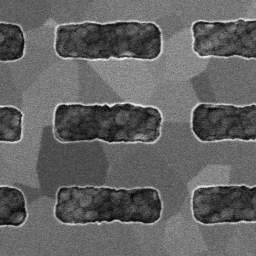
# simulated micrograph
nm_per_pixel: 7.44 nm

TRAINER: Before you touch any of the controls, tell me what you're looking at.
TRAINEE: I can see holes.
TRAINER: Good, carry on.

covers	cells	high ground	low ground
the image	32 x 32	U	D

UUUUUUUUUUUUUUUUUUUUUUUUUUUUUUUU
UUUUUUUUUUUUUUUUUUUUUUUUUUUUUUUU
UUUUUUUUUUUUUUUUUUUUUUUUUUUUUUUU
DDDUUUUDDDDDDDDDUDDDUUUUDDDDDDDD
DDDUUUUDDDDDDDDDDDDDUUUUDDDDDDDD
DDDUUUUDDDDDDDDDDDDDUUUUDDDDDDDD
DDDUUUUDDDDDDDDDDDDDUUUUDDDDDDDD
DDUUUUUUUUUUUUUUUUUUUUUUUUUUUUUU
UUUUUUUUUUUUUUUUUUUUUUUUUUUUUUUU
UUUUUUUUUUUUUUUUUUUUUUUUUUUUUUUU
UUUUUUUUUUUUUUUUUUUUUUUUUUUUUUUU
UUUUUUUUUUUUUUUUUUUUUUUUUUUUUUUU
UUUUUUUUUUUUUUUUUUUUUUUUUUUUUUUU
DDUUUUUDDDDDDDDDDDDUUUUUDDDDDDDD
DDDUUUUDDDDDDDDUDDDDUUUUDDDDDDDD
DDDUUUUDDDDDDDDDUDDDUUUUDDDDDDDD
DDDUUUUDDDDDDDDDDDDDUUUUDDDDDDDD
DDUUUUUDDDDUUDDDDUDUUUUUUDDDUUDD
UUUUUUUUUUUUUUUUUUUUUUUUUUUUUUUU
UUUUUUUUUUUUUUUUUUUUUUUUUUUUUUUU
UUUUUUUUUUUUUUUUUUUUUUUUUUUUUUUU
UUUUUUUUUUUUUUUUUUUUUUUUUUUUUUUU
UUUUUUUUUUUUUUUUUUUUUUUUUUUUUUUU
DDUUUUUUDDDDDDUUUUDUUUUUUDDDDDDD
DDDUUUUDDDDDDDDDDDDDUUUUDDDDDDDD
DDDUUUUDDDDDDDDDDDDDUUUUDDDDDDDD
UDDUUUUDDDDDDDDDDDDDUUUUDDDDUDDD
DDUUUUUDDDDUDDDDDDDDUUUUUDDDDDDD
UUUUUUUUUUUUUUUUUUUUUUUUUUUUUUUU
UUUUUUUUUUUUUUUUUUUUUUUUUUUUUUUU
UUUUUUUUUUUUUUUUUUUUUUUUUUUUUUUU
UUUUUUUUUUUUUUUUUUUUUUUUUUUUUUUU